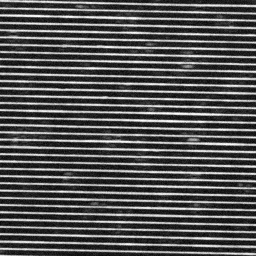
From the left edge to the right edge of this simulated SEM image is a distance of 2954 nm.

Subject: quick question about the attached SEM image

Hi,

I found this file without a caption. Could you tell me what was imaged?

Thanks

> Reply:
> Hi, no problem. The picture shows parallel lines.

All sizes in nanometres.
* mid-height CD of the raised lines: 18.8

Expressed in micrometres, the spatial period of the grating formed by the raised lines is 0.0841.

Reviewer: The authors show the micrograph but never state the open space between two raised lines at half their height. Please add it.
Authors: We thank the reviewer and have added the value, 66.4 nm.